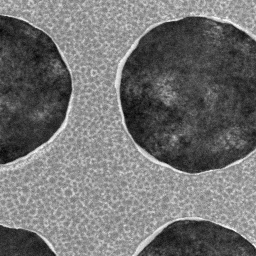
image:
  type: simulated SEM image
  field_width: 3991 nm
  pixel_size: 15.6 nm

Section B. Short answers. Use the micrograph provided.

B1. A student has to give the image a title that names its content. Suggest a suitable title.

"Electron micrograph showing holes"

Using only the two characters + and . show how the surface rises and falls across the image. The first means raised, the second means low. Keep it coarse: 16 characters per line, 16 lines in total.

++++++++++++++++
..++++++++....++
...++++++.......
....++++........
....++++........
....+++.........
....++++........
....++++........
...+++++........
..+++++++.......
+++++++++++...++
++++++++++++++++
++++++++++++++++
++++++++++++++++
..++++++++.....+
...++++++.......